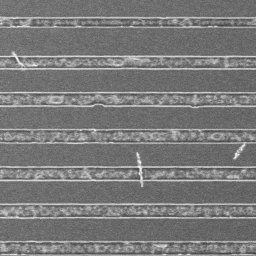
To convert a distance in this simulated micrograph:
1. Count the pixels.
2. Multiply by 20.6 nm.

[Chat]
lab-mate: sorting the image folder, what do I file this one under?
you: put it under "parallel lines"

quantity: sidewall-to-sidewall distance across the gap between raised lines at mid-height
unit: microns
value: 0.257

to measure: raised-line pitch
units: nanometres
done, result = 774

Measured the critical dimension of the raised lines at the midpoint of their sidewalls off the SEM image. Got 0.499 micrometres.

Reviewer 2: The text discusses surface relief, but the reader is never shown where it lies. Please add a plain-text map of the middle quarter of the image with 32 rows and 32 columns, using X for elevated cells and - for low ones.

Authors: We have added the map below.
--------------------------------
XXXXXXXXXXXXXXXXXXXXXXXXXXXXXXXX
XXXXXXXXXXXXXXXXXXXXXXXXXXXXXXXX
XXXXXXXXXXXXXXXXXXXXXXXXXXXXXXXX
XXXXXXXXXXXXXXXXXXXXXXXXXXXXXXXX
XXXXXXXXXXXXXXXXXXXXXXXXXXXXXXXX
XXXXXXXXXXXXXXXXXXXXXXXXXXXXXXXX
--------------------------------
--------------------------------
--------------------------------
-------XXX----------------------
XXXXXXXXXXXXXXXXXXXXXXXXXXXXXXXX
XXXXXXXXXXXXXXXXXXXXXXXXXXXXXXXX
XXXXXXXXXXXXXXXXXXXXXXXXXXXXXXXX
XXXXXXXXXXXXXXXXXXXXXXXXXXXXXXXX
XXXXXXXXXXXXXXXXXXXXXXXXXXXXXXXX
--------------------------------
--------------------------------
--------------------------------
--------------------------------
XXXXXXXXXXXXXXXXXXXXXXXXXXXXXXXX
XXXXXXXXXXXXXXXXXXXXXXXXXXXXXXXX
XXXXXXXXXXXXXXXXXXXXXXXXXXXXXXXX
XXXXXXXXXXXXXXXXXXXXXXXXXXXXXXXX
XXXXXXXXXXXXXXXXXXXXXXXXXXXXXXXX
XXXXXXXXXXXXXXXXXXXXXXXXXXXXXXXX
--------------------------------
--------------------------------
--------------------------------
XXXXXXXXXXXXXXXXXXXXXXXXXXXXXXXX
XXXXXXXXXXXXXXXXXXXXXXXXXXXXXXXX
XXXXXXXXXXXXXXXXXXXXXXXXXXXXXXXX